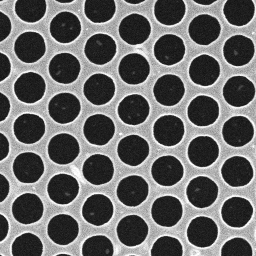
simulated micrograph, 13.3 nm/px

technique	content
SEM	a regular array of holes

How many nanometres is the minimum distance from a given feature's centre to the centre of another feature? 530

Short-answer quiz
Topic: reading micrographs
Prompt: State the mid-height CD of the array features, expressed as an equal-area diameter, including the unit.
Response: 420 nm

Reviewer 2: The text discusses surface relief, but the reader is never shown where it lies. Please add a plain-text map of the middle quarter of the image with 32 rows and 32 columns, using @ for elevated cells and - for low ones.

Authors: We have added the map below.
----@@@@@@@@@@-------@@@@@@@@@@-
----@@@@@@@@@@--------@@@@@@@@@-
----@@@@--@@@@-------@@@@@@@@@@-
---@@@------@@-------@@@-----@@@
--@@@-------@@@-----@@@-------@@
@@@@@--------@@@@@@@@@@-------@@
@@@@@--------@@@@@@@@@--------@@
--@@@--------@@@@@@@@@--------@@
---@@@------@@@-----@@@-------@@
----@@-----@@@-------@@------@@@
----@@@@@@@@@@-------@@@@@@@@@@-
----@@@@@@@@@---------@@@@@@@@@-
----@@@@-@@@@@-------@@@@@@@@@@-
---@@@-----@@@-------@@@-----@@-
--@@@-------@@@-----@@@-------@@
@@@@@--------@@@@@@@@@--------@@
@@@@@--------@@@@@@@@@--------@@
-@@@@--------@@@@@@@@@--------@@
---@@-------@@@-----@@@-------@@
----@@-----@@@-------@@------@@@
----@@@@@@@@@--------@@@@@-@@@@-
----@@@@@@@@@--------@@@@@@@@@@-
----@@@@-@@@@--------@@@@@@@@@@-
---@@@-----@@@-------@@@----@@@-
--@@@-------@@@-----@@@------@@@
@@@@@-------@@@@@-@@@@--------@@
@@@@@--------@@@@@@@@@--------@@
-@@@@-------@@@@@@@@@@--------@@
---@@-------@@@-----@@--------@@
----@@-----@@@-------@@-----@@@-
----@@@@@@@@@--------@@@@--@@@@-
----@@@@@@@@@--------@@@@@@@@@@-